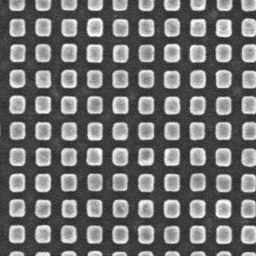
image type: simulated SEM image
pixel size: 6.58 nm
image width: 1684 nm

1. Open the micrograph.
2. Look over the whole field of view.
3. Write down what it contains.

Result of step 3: a regular array of raised bodies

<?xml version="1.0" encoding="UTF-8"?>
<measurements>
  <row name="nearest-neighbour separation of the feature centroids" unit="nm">166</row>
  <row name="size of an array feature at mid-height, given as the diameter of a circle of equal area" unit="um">0.111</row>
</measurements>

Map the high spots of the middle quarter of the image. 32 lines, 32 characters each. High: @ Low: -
--------------------------------
--------------------------------
@@@---@@@----@@@---@@@---@@@@---
@@@---@@@----@@@---@@@---@@@@---
@@@---@@@---@@@@---@@@---@@@@---
@@@---@@@----@@----@@@---@@@@---
--------------------------------
--------------------------------
@@----@@@----@@----@@@----@@----
@@@---@@@----@@@---@@@---@@@@---
@@@---@@@----@@@---@@@---@@@@---
@@@---@@@----@@@---@@@---@@@@---
--------------------------@@----
--------------------------------
--------------------------------
@@@---@@@---@@@@---@@@---@@@@---
@@@---@@@---@@@@---@@@---@@@@---
@@@---@@@---@@@@---@@@---@@@@---
@@@---@@@----@@@---@@@---@@@@---
--------------------------------
--------------------------------
@@@---@@@----@@@---@@@----@@@---
@@@---@@@----@@@---@@@---@@@@---
@@@---@@@----@@@---@@@---@@@@---
@@@---@@@----@@@---@@@---@@@@---
--------------------------------
--------------------------------
--------------------------------
@@@---@@@---@@@@---@@@---@@@@---
@@@---@@@---@@@@---@@@---@@@@---
@@@---@@@---@@@@---@@@---@@@@---
@@-----@@----@@----@@@----@@----